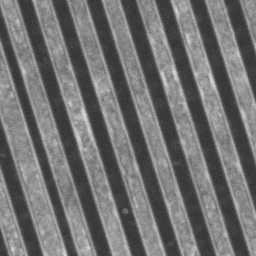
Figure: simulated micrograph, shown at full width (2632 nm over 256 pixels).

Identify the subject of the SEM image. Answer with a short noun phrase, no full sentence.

parallel lines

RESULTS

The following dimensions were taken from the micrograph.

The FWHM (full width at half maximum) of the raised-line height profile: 185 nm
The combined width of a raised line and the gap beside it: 0.335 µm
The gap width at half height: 0.147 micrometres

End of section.